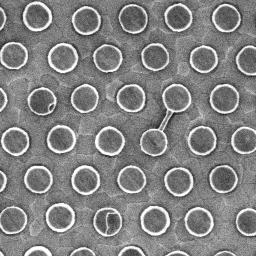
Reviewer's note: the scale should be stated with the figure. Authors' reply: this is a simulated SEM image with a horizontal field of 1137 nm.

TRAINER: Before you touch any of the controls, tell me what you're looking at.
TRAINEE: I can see a regular array of raised bodies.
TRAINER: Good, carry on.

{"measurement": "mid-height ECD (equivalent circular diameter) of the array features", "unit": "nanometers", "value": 120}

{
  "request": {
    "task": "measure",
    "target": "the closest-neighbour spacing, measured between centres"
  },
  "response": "195 nanometers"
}